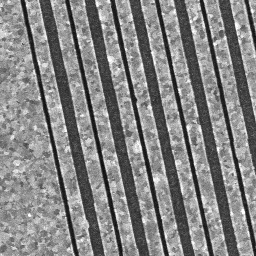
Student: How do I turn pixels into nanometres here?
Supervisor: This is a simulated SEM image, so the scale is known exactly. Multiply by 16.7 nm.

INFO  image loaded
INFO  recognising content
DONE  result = parallel lines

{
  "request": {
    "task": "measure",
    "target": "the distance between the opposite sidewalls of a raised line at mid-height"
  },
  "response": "216 nanometers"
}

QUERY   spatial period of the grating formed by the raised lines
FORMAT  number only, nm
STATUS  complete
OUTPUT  369